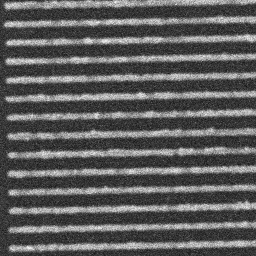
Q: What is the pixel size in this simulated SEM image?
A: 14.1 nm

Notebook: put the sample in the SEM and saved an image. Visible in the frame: parallel lines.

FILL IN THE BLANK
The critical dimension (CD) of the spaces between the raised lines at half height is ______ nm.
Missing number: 194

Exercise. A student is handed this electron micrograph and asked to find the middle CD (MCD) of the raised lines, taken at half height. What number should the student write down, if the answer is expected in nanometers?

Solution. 68.8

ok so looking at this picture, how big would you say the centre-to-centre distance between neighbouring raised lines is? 264 nm